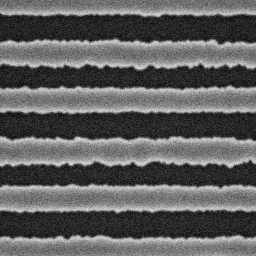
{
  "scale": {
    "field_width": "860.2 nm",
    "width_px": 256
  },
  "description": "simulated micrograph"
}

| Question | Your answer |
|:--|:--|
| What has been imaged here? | lines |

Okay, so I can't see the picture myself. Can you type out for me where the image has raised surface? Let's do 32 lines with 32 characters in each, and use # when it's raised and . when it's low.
################################
################################
................................
................................
................................
###########################.####
################################
################################
.................#...#.........#
................................
................................
################################
################################
################################
................................
................................
................................
#.######.##.####.#############..
################################
################################
####.###..#..###.#....#.##.###..
................................
................................
################################
################################
################################
..#...........#.................
................................
................................
............#...................
################################
################################